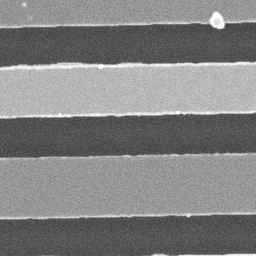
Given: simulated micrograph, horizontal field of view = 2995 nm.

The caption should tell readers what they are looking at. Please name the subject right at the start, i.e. lines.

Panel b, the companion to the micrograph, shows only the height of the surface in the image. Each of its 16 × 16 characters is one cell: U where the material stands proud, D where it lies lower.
UUUUUUUUUUUUUUUU
UUUUUUUUUUDDDUDD
DDDDDDDDDDDDDDDD
DDDDDDDDDDDDDDDD
UUUUUUUUUUUUUUUU
UUUUUUUUUUUUUUUU
UUUUUUUUUUUUUUUU
DDDDDDDDDDDDDDDD
DDDDDDDDDDDDDDDD
DDDDDDDDDDDDDDDD
UUUUUUUUUUUUUUUU
UUUUUUUUUUUUUUUU
UUUUUUUUUUUUUUUU
UUUUUUUUDDDDDDDD
DDDDDDDDDDDDDDDD
DDDDDDDDDDDDDDDD